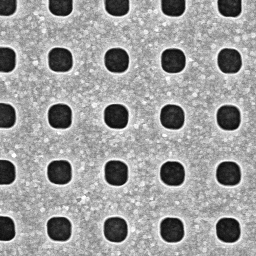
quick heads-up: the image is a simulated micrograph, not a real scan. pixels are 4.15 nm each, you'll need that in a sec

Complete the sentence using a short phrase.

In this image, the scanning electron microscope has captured a regular array of holes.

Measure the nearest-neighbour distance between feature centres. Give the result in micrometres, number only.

0.233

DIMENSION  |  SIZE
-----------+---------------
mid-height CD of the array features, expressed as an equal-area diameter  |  109 nanometres